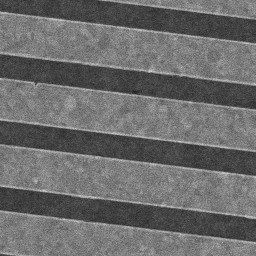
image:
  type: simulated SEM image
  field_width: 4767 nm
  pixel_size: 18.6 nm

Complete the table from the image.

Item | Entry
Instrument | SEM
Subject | one or a few lines or trenches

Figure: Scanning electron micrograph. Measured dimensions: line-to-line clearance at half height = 483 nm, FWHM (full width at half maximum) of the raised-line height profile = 742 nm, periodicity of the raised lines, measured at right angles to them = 66.1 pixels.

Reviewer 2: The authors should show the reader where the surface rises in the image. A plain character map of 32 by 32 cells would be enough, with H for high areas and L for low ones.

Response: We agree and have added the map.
LLLLLLLLLLLLLLLLLHHHHHHHHHHHHHHH
LLLLLLLLLLLLLLLLLLLLLLLLLHHHHHHH
HHHHHHHHLLLLLLLLLLLLLLLLLLLLLLLL
HHHHHHHHHHHHHHHHLLLLLLLLLLLLLLLL
HHHHHHHHHHHHHHHHHHHHHHHHLLLLLLLL
HHHHHHHHHHHHHHHHHHHHHHHHHHHHHHHH
HHHHHHHHHHHHHHHHHHHHHHHHHHHHHHHH
LLLLLLLLHHHHHHHHHHHHHHHHHHHHHHHH
LLLLLLLLLLLLLLLLHHHHHHHHHHHHHHHH
LLLLLLLLLLLLLLLLLLLLLLLLHHHHHHHH
HHHHLLLLLLLLLLLLLLLLLLLLLLLLLLLL
HHHHHHHHHHHHHLLLLLLLLLLLLLLLLLLL
HHHHHHHHHHHHHHHHHHHHHLLLLLLLLLLL
HHHHHHHHHHHHHHHHHHHHHHHHHHHHHLLL
HHHHHHHHHHHHHHHHHHHHHHHHHHHHHHHH
LLLLLHHHHHHHHHHHHHHHHHHHHHHHHHHH
LLLLLLLLLLLLLHHHHHHHHHHHHHHHHHHH
LLLLLLLLLLLLLLLLLLLLLHHHHHHHHHHH
HHLLLLLLLLLLLLLLLLLLLLLLLLLLLHHH
HHHHHHHHHHLLLLLLLLLLLLLLLLLLLLLL
HHHHHHHHHHHHHHHHHHLLLLLLLLLLLLLL
HHHHHHHHHHHHHHHHHHHHHHHHHHLLLLLL
HHHHHHHHHHHHHHHHHHHHHHHHHHHHHHHH
LLHHHHHHHHHHHHHHHHHHHHHHHHHHHHHH
LLLLLLLLLLHHHHHHHHHHHHHHHHHHHHHH
LLLLLLLLLLLLLLLLLLHHHHHHHHHHHHHH
LLLLLLLLLLLLLLLLLLLLLLLLLLHHHHHH
HHHHHHHHLLLLLLLLLLLLLLLLLLLLLLLL
HHHHHHHHHHHHHHHHLLLLLLLLLLLLLLLL
HHHHHHHHHHHHHHHHHHHHHHHHLLLLLLLL
HHHHHHHHHHHHHHHHHHHHHHHHHHHHHHHH
HHHHHHHHHHHHHHHHHHHHHHHHHHHHHHHH